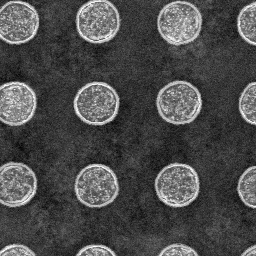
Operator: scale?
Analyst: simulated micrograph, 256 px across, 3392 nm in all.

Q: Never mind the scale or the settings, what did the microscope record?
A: raised bodies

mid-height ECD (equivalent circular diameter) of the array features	0.56	µm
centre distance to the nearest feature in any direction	1070	nanometres